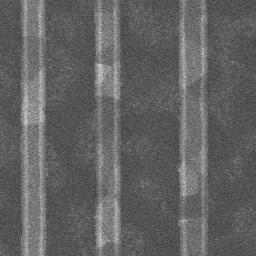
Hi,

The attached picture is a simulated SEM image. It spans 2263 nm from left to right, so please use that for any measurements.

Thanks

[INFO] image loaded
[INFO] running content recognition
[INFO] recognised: one or a few lines or trenches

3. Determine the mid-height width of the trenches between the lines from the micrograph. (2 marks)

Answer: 558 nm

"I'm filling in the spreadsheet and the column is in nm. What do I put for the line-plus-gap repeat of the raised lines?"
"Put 707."